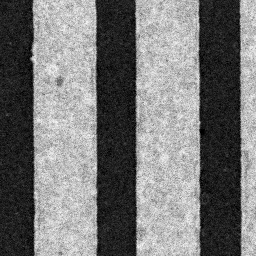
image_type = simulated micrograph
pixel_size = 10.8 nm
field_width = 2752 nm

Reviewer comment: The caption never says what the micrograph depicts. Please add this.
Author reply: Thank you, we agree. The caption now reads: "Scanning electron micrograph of one or a few lines or trenches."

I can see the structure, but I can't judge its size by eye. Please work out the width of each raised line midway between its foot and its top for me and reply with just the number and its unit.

662 nanometers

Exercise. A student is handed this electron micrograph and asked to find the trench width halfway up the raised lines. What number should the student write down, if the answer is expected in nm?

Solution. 445